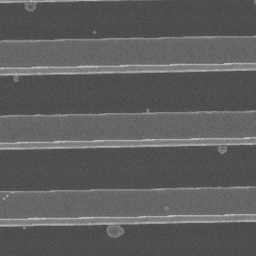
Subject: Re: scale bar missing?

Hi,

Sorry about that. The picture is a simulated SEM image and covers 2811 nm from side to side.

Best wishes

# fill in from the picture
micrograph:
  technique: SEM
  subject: lines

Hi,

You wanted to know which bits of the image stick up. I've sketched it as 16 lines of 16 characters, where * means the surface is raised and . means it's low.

................
................
...*************
****************
********........
................
................
****************
****************
................
................
................
****************
****************
................
................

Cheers